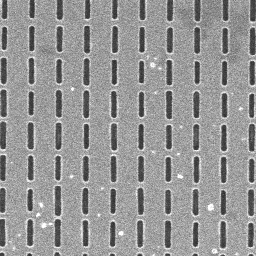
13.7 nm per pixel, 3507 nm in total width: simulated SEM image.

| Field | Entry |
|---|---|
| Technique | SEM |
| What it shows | a regular array of holes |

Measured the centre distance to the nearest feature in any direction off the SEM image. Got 0.375 µm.